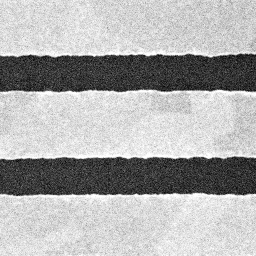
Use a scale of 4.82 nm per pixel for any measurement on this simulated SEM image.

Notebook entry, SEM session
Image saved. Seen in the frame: lines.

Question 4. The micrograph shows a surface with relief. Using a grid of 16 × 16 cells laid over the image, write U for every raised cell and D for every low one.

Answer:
UUUUUUUUUUUUUUUU
UUUUUUUUUUUUUUUU
UUUUUUUUUUUUUUUU
DDDDDDDDDDDDDDDD
DDDDDDDDDDDDDDDD
DDDDDDDDDDDDDDDD
UUUUUUUUUUUUUUUU
UUUUUUUUUUUUUUUU
UUUUUUUUUUUUUUUU
UUUUUUUUUUUUUUUU
DDDDDDDDDDDDDDDD
DDDDDDDDDDDDDDDD
UUUUUUUUUUUUUUUU
UUUUUUUUUUUUUUUU
UUUUUUUUUUUUUUUU
UUUUUUUUUUUUUUUU